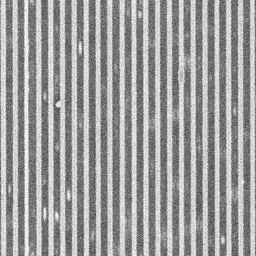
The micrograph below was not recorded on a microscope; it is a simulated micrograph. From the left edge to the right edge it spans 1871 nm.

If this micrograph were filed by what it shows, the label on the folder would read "parallel lines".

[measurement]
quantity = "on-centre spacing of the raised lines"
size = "86.7 nm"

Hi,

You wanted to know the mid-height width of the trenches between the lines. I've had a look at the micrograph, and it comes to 0.0557 um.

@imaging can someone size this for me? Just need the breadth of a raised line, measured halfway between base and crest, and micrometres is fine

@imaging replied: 0.0283